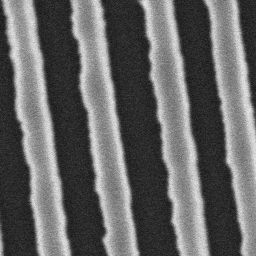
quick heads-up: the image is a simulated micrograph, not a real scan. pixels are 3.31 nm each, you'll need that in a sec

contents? lines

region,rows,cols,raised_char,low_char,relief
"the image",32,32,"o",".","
.ooo.....ooo......ooo.....oooo..
.ooo.....oooo.....ooo.....oooo..
.ooo.....oooo.....oooo....oooo..
.ooo.....oooo.....oooo....oooo..
.ooo.....oooo......ooo....oooo..
.oooo.....ooo......ooo.....ooo..
..ooo.....ooo......ooo.....ooo..
..ooo.....ooo......oooo....ooo..
..ooo.....ooo......oooo....oooo.
..ooo.....oooo.....oooo....oooo.
..ooo.....oooo.....oooo....oooo.
..oooo....oooo.....oooo....oooo.
..oooo....oooo......ooo.....ooo.
..oooo.....ooo......ooo.....ooo.
..oooo.....ooo......ooo.....ooo.
...ooo.....oooo.....oooo....oooo
...ooo.....oooo.....oooo....oooo
...ooo.....oooo.....oooo....oooo
...oooo.....ooo.....oooo....oooo
...oooo.....ooo.....oooo....oooo
....ooo.....ooo......ooo....oooo
....ooo.....oooo.....ooo.....ooo
....ooo.....oooo.....oooo....ooo
....ooo.....oooo.....oooo....ooo
....ooo.....oooo.....oooo....ooo
....oooo.....ooo......ooo.....oo
....oooo.....ooo......ooo.....oo
....oooo.....oooo.....ooo.....oo
.....ooo.....oooo.....ooo.....oo
.....ooo.....oooo.....oooo....oo
.....ooo.....oooo.....oooo....oo
.....oooo....oooo......ooo....oo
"